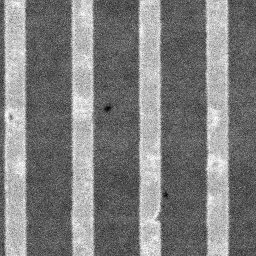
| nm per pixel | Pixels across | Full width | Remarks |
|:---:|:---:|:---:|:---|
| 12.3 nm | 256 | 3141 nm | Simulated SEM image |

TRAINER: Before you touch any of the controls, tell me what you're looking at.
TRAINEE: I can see one or a few lines or trenches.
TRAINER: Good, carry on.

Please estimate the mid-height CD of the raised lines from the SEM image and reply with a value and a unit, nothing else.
228 nm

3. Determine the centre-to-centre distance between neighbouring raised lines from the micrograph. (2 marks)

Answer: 827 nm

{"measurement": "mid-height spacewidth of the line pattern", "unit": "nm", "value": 595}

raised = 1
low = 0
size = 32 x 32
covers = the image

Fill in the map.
01100000011000000011000000110000
01100000011000000011000000110000
01100000011000000011000000110000
01100000011000000011000000110000
01100000011000000011000000110000
01100000011000000011000000110000
01100000011000000011000000110000
01100000011000000011000000110000
01100000011000000011000000110000
01100000011000000011000000110000
01100000011000000011000000110000
01100000011000000011000000110000
01100000011100000011000000110000
01100000011000000011000000110000
00100000011000000011000000110000
01100000011000000011000000110000
01100000011000000011000000110000
01100000011000000011000000110000
01100000011000000011000000110000
01100000011000000011000000110000
01100000011000000011000000110000
01100000011000000011000000110000
01100000011000000011000000110000
01100000011000000011000000110000
01100000011000000011000000110000
01100000011100000011000000110000
01100000011100000011000000110000
01100000011000000010000000110000
01100000011000000011000000110000
01100000011100000011000000110000
01100000011100000011000000110000
01100000011100000011000000110000